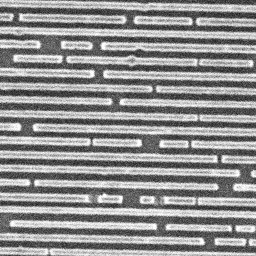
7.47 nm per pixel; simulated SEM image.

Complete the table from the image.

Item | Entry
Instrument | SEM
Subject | parallel lines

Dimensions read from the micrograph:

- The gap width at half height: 63.5 nanometres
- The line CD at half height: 5.62 pixels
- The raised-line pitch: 103 nanometers